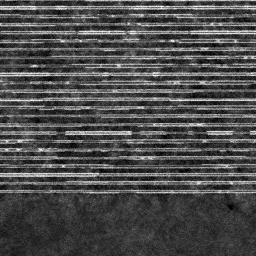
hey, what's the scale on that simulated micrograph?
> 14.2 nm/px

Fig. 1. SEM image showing parallel lines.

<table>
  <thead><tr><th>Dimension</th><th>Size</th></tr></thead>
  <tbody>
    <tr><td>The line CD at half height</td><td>37.3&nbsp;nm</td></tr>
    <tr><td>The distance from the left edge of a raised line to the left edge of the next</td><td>119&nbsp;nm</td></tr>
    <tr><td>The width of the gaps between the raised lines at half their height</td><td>88.9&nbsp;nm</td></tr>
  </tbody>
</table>